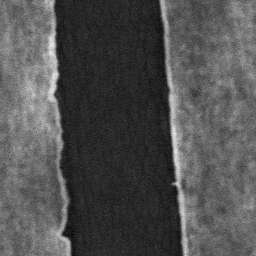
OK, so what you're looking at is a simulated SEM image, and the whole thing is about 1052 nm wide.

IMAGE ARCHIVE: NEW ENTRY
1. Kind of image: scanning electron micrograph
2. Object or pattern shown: one or a few lines or trenches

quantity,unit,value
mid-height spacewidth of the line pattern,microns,0.469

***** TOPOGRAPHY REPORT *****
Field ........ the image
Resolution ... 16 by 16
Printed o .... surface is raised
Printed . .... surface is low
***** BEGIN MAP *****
ooo.......oooooo
ooo.......oooooo
ooo.......oooooo
ooo.......oooooo
ooo........ooooo
ooo........ooooo
ooo........ooooo
oooo.......ooooo
oooo.......ooooo
oooo.......ooooo
oooo.......ooooo
oooo.......ooooo
oooo.......ooooo
oooo.......ooooo
oooo.......ooooo
oooo........oooo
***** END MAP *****